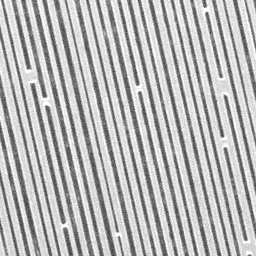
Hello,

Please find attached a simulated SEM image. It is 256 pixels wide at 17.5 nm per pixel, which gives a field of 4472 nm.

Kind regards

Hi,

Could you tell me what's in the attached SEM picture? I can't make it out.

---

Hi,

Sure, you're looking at parallel lines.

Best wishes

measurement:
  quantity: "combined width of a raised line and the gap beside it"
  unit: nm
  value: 180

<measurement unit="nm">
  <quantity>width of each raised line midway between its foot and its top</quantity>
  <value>89.5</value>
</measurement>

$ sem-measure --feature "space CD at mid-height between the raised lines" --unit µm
0.0895